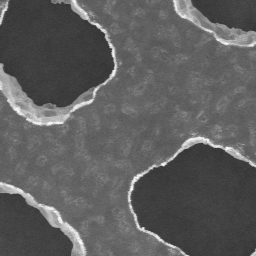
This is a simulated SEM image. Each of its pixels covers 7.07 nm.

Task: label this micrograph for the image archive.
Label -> holes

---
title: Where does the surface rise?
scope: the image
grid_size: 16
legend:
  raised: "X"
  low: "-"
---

-----XXXXXXX----
------XXXXXXX---
-------XXXXXXXXX
-------XXXXXXXXX
-------XXXXXXXXX
X-----XXXXXXXXXX
XX---XXXXXXXXXXX
XXXXXXXXXXXXXXXX
XXXXXXXXXXXXXXXX
XXXXXXXXXXX---XX
XXXXXXXXXX------
XXXXXXXX--------
--XXXXXX--------
---XXXXX--------
----XXXXX-------
-----XXXXXX-----